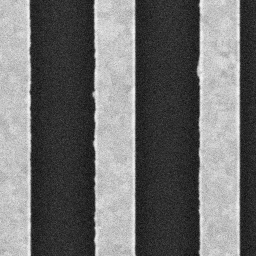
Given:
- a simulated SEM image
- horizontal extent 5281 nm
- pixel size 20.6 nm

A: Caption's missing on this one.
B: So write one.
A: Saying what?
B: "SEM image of lines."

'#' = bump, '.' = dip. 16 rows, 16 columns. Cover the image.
##....##.....##.
##....##.....##.
##....##.....##.
##....##.....##.
##....##.....##.
##....##.....##.
##....##.....##.
##....##....###.
##....##.....##.
##....##....###.
##....##....###.
##....##....###.
##....##....###.
##....##....###.
##....##.....##.
##....##.....##.